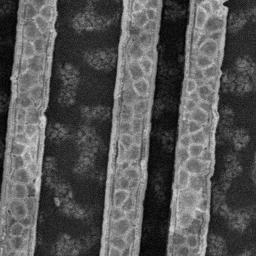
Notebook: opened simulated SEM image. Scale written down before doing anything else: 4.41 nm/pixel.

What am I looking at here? one or a few lines or trenches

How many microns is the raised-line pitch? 0.362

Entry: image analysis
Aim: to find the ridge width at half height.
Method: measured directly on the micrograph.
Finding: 153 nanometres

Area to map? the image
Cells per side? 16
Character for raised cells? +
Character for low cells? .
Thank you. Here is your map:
.++.....++..++..
.++.....++..++..
.++.....++..++..
.++.....++..++..
.++....+++..++..
.++....+++.+++..
.++....++..+++..
.++....++..+++..
.++....++..++...
+++....++..++...
+++....++..++...
++.....++..++...
++.....++..++...
++.....++..++...
++.....++..++...
++....+++..++...